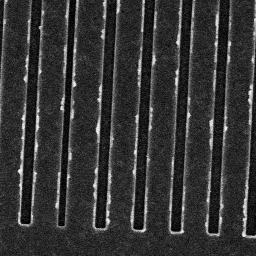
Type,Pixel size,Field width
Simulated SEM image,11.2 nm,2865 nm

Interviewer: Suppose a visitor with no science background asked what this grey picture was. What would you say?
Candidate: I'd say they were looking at parallel lines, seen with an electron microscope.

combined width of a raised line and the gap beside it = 421 nanometres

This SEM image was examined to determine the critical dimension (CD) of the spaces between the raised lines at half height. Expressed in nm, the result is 117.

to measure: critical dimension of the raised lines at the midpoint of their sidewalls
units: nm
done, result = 300